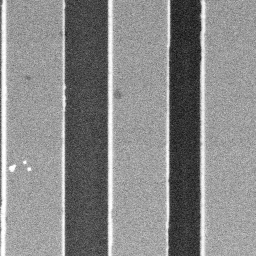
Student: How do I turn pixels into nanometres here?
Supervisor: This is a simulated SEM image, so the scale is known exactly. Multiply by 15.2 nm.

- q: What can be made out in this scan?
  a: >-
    lines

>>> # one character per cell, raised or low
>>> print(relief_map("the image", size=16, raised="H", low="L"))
HHHHLLLHHHHLLHHH
HHHHLLLHHHHLLHHH
HHHHLLLHHHHLLHHH
HHHHLLLHHHHLLHHH
HHHHLLLHHHHLLHHH
HHHHLLLHHHHLLHHH
HHHHLLLHHHHLLHHH
HHHHLLLHHHHLLHHH
HHHHLLLHHHHLLHHH
HHHHLLLHHHHLLHHH
HHHHLLLHHHHLLHHH
HHHHLLLHHHHLLHHH
HHHHLLLHHHHLLHHH
HHHHLLLHHHHLLHHH
HHHHLLLHHHHLLHHH
HHHHLLLHHHLLLHHH